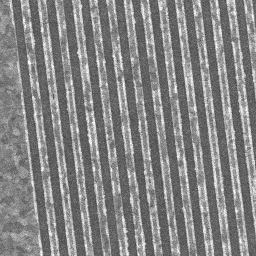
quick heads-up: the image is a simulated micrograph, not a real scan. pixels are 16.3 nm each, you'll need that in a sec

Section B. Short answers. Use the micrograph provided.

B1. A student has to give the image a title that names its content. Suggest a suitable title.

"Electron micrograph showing parallel lines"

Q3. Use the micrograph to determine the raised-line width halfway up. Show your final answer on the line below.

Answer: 0.127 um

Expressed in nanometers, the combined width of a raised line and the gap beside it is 277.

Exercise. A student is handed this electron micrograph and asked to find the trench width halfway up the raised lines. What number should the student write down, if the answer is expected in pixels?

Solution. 9.55